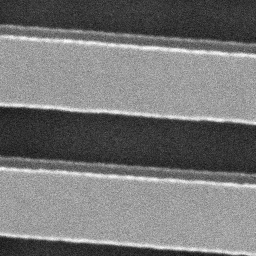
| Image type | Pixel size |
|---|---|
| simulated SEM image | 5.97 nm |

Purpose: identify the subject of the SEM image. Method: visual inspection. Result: lines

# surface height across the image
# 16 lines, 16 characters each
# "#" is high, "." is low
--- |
................
................
####............
################
################
################
################
.............###
................
................
#...............
###############.
################
################
################
..........######